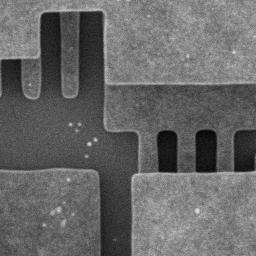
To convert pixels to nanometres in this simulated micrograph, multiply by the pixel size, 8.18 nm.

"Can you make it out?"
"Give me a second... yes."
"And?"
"wiring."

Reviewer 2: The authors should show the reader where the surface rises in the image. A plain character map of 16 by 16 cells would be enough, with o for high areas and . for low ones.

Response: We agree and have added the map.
oooooooooooooooo
oo.....ooooooooo
oo.....ooooooooo
oo.....ooooooooo
.......ooooooooo
................
................
................
................
................
................
........oooooooo
........oooooooo
........oooooooo
........oooooooo
........oooooooo